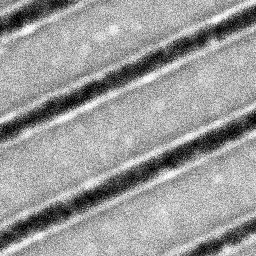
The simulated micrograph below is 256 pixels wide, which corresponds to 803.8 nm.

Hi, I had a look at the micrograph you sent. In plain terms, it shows one or a few lines or trenches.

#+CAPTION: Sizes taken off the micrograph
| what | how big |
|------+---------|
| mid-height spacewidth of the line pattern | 214 nm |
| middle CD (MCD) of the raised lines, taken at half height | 86.4 nanometers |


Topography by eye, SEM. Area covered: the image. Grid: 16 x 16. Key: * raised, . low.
.****..........*
***.........****
*.........****..
........****....
......****......
....****........
..****..........
****..........**
**..........****
..........****..
.......*****....
.....*****......
...****.........
.****..........*
***..........***
*..........****.